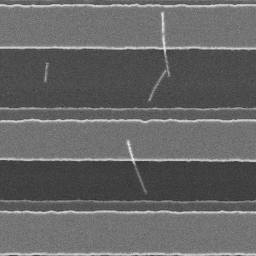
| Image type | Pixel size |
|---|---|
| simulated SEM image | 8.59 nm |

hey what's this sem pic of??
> lines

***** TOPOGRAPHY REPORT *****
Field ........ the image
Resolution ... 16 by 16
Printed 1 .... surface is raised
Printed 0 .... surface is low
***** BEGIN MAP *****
1111111111111111
1111111111111111
1111111111111111
0000000000000000
0000000000000000
0000000000000000
0000000000000000
0111111111111111
1111111111111111
1111111111111111
0000000000000000
0000000000000000
0000000000000000
1111111111111111
1111111111111111
1111111111111111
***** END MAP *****